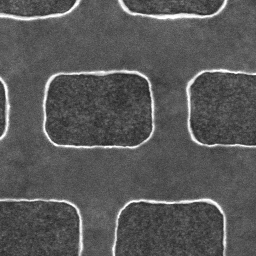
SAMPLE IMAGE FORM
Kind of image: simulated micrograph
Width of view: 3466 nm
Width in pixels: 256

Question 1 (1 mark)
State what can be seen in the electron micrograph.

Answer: holes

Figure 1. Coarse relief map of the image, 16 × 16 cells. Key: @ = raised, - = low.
----@@@@------@@
@@@@@@@@@@@@@@@@
@@@@@@@@@@@@@@@@
@@@@@@@@@@@@@@@@
@@@@@@@@@@@@@@@@
@@@------@@@----
@@@------@@@----
@@@-------@@----
@@@------@@@----
@@@@@@@@@@@@@@@@
@@@@@@@@@@@@@@@@
@@@@@@@@@@@@@@@@
@@@@@@@@@@@@@@@@
-----@@-------@@
-----@@-------@@
-----@@-------@@